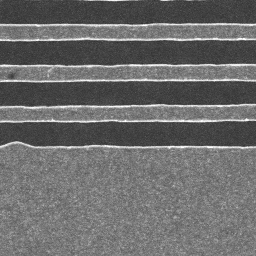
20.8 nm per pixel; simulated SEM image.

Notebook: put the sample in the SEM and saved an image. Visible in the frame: parallel lines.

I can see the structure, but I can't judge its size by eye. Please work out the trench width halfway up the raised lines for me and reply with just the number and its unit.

510 nm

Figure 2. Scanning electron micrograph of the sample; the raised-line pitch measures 848 nm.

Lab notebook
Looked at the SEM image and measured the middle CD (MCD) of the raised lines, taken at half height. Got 325 nanometers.